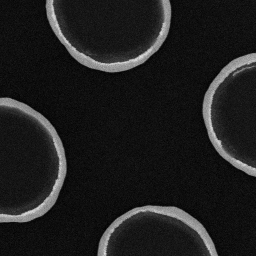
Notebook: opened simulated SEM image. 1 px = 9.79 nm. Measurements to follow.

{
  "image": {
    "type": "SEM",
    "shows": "raised bodies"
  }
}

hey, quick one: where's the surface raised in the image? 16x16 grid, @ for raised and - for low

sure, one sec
---@@@@@@@------
---@@@@@@@------
----@@@@@@------
-----@@@@-------
--------------@@
-------------@@@
@------------@@@
@@@----------@@@
@@@----------@@@
@@@@----------@@
@@@@-----------@
@@@@------------
@@@-------------
@@------@@@-----
-------@@@@@@---
------@@@@@@@---